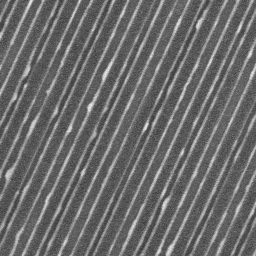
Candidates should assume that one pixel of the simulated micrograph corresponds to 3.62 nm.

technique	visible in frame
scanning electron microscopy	parallel lines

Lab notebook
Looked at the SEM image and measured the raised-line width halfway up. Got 57 nm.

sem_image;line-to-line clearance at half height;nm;25.5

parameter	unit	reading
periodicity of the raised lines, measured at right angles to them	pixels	22.1